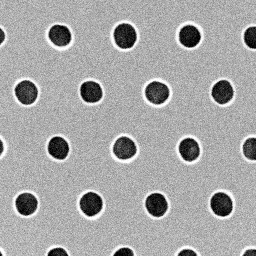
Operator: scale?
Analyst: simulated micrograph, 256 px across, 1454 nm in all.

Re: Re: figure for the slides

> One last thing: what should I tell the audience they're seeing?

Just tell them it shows a regular array of holes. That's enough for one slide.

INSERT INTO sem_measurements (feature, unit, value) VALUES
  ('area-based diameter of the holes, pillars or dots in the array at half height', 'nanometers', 134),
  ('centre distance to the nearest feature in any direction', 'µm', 0.365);